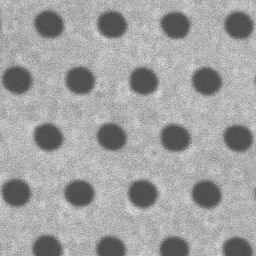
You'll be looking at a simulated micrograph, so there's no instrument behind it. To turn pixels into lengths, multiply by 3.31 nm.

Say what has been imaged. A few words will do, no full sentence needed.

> a regular array of holes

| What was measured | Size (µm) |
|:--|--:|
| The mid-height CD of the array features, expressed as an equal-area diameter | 0.0944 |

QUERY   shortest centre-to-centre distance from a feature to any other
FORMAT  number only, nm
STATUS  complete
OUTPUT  210